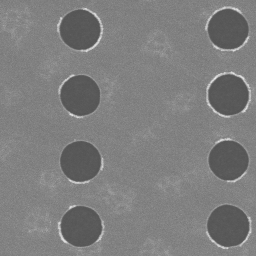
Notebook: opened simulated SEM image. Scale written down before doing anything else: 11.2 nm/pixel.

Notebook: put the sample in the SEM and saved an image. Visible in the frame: a regular array of holes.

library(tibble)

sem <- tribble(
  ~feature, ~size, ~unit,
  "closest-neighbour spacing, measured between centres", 734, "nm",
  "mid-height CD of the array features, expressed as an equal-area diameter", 0.458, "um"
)